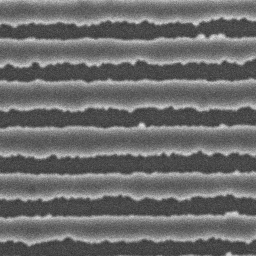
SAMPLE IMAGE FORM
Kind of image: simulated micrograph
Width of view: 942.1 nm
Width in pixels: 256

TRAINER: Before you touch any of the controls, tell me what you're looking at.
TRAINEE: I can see lines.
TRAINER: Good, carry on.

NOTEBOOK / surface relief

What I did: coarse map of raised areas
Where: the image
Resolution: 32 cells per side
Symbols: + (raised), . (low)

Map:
++++++++++++++++++++++++++++++++
++++++++++++++++++++++++++++++++
++++++++++++++++++++++++++.....+
................................
...........................+....
++++++++++++++++++++++++++++++++
++++++++++++++++++++++++++++++++
+++++++++++++++++++++++++++++++.
................................
................................
++++++++++++++++++++++++++++++++
++++++++++++++++++++++++++++++++
++++++++++++++++++++++++++++++++
+++++++++++..++++.......++++++..
................................
................................
++++++++++++++++++++++++++++++++
++++++++++++++++++++++++++++++++
++++++++++++++++++++++++++++++++
+..+++.+++++....................
................................
................................
++++++++++++++++++++++++++++++++
++++++++++++++++++++++++++++++++
+++++++++++++...+++++++++++..+++
................................
................................
++++++++++++++++++++++++++++++++
++++++++++++++++++++++++++++++++
++++++++++++++++++++++++++++++++
...+............................
................................